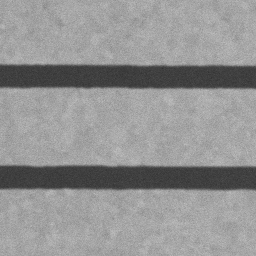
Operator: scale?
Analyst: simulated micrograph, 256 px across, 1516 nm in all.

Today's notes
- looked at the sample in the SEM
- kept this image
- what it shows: lines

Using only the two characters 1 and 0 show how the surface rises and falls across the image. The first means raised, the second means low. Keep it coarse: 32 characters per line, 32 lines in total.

11111111111111111111111111111111
11111111111111111111111111111111
11111111111111111111111111111111
11111111111111111111111111111111
11111111111111111111111111111111
11111111111111111111111111111111
11111111111111111111111111111111
11111111111111111111111111111111
00000000000000000000000000000000
00000000000000000000000000000000
00000000000000000000000000000000
11111111111111111111111111111111
11111111111111111111111111111111
11111111111111111111111111111111
11111111111111111111111111111111
11111111111111111111111111111111
11111111111111111111111111111111
11111111111111111111111111111111
11111111111111111111111111111111
11111111111111111111111111111111
11111111111111111111111111111111
00000000000000000000000000000000
00000000000000000000000000000000
00000000000000000000000000000000
11111111111111111111111111111111
11111111111111111111111111111111
11111111111111111111111111111111
11111111111111111111111111111111
11111111111111111111111111111111
11111111111111111111111111111111
11111111111111111111111111111111
11111111111111111111111111111111